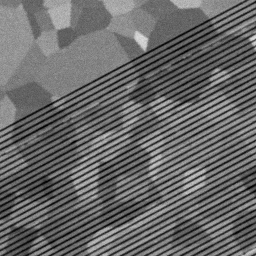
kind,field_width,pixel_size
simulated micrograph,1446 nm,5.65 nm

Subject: parallel lines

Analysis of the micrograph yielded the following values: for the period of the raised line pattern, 31.5 nm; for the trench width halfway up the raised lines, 10.6 nm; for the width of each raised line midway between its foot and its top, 20.6 nm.